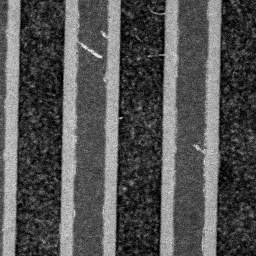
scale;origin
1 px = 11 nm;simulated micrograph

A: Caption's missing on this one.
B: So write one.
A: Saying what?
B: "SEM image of one or a few lines or trenches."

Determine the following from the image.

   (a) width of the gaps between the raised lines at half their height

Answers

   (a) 0.644 um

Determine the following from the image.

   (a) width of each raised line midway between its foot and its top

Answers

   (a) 467 nm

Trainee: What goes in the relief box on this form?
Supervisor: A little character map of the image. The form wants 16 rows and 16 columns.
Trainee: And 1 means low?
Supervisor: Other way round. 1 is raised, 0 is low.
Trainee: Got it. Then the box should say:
1000111000011000
1000111000011000
1000111000011000
1000111000011000
1000111000011000
1000111000011000
1000111000011000
1000111000011000
1000111000011000
1000111000011000
1000111000011000
1000111000011000
1000111000111000
1000111000111000
1000111000111000
1000111000111000